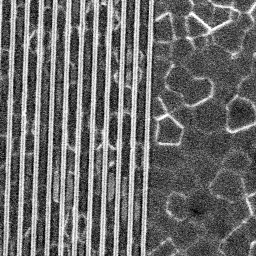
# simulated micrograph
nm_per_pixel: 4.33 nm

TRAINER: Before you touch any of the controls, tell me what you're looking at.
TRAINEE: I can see parallel lines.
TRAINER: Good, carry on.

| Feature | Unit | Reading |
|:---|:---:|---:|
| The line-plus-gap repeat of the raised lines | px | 13.7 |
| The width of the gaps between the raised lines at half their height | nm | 46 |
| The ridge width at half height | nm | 15.2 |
